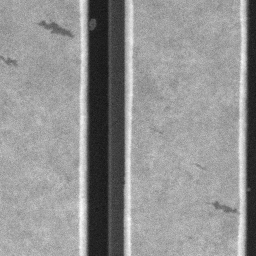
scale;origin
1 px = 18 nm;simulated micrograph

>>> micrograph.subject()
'lines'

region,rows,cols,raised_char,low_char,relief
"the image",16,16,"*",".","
*****...*******.
*****...*******.
*****...*******.
*****...*******.
*****...*******.
*****...*******.
*****...*******.
*****...*******.
*****...*******.
*****...*******.
*****...*******.
*****...*******.
*****...*******.
*****...*******.
*****...*******.
*****...*******.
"